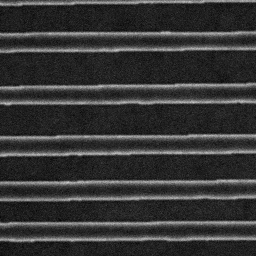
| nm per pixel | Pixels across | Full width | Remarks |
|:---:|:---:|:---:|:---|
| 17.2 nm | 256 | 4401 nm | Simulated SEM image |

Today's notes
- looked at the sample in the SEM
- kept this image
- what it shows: lines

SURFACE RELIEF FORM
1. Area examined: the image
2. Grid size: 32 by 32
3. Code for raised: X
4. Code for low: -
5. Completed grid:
XXXXXXXXXX----------------------
--------------------------------
--------------------------------
--------------------------------
XXXXXXXXXXXXXXXXXXXXXXXXXXXXXXXX
XXXXXXXXXXXXXXXXXXXXXXXXXXXXXXXX
--------------------------------
--------------------------------
--------------------------------
--------------------------------
-------------------------------X
XXXXXXXXXXXXXXXXXXXXXXXXXXXXXXXX
XXXXXXXXXXXXXXXXXXXXXXXXXXXXXXXX
--------------------------------
--------------------------------
--------------------------------
--------------------------------
XXXXXXXXXXXXXXXXXXXXXXXXXXXXXXXX
XXXXXXXXXXXXXXXXXXXXXXXXXXXXXXXX
--------------------------------
--------------------------------
--------------------------------
--------------------------------
XXXXXXXXXXXXXXXXXXXXXXXXXXXXXXXX
XXXXXXXXXXXXXXXXXXXXXXXXXXXXXXXX
--------------------------------
--------------------------------
--------------------------------
XXXXXXXXXXXXXXXXXXXXXXXXXXXXXXXX
XXXXXXXXXXXXXXXXXXXXXXXXXXXXXXXX
--------------------------------
--------------------------------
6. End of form